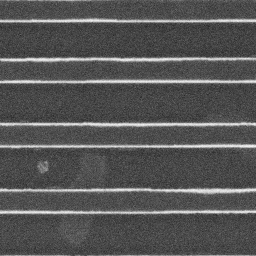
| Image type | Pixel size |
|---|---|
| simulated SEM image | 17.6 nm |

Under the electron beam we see lines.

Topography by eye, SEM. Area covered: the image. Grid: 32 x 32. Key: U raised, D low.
UUUUUUUUUUUUUUUUUUUUUUUUUUUUUUUU
UUUUUUUUUUUUUUUUUUUUUUUUUUUUUUUU
UUUUUUUUUUUUUUUUUUUUUUUUUUUUUUUU
DDDDDDDDDDDDDDDDDDDDDDDDDDDDDDDD
DDDDDDDDDDDDDDDDDDDDDDDDDDDDDDDD
DDDDDDDDDDDDDDDDDDDDDDDDDDDDDDDD
DDDDDDDDDDDDDDDDDDDDDDDDDDDDDDDD
UDDUUDDUUUUUUUUDUUUUUUUUUUUUUUUU
UUUUUUUUUUUUUUUUUUUUUUUUUUUUUUUU
UUUUUUUUUUUUUUUUUUUUUUUUUUUUUUUU
DDDDDDDDDDDDDDDDDDDDDDDDDDDDDDDD
DDDDDDDDDDDDDDDDDDDDDDDDDDDDDDDD
DDDDDDDDDDDDDDDDDDDDDDDDDDDDDDDD
DDDDDDDDDDDDDDDDDDDDDDDDDDDDDDDD
DDDDDDDDDDDDDDDDDDDDDDDDDDDDDDDD
DDUUDDUUUUUDDDDDDDDDDDDDDDDDUUUU
UUUUUUUUUUUUUUUUUUUUUUUUUUUUUUUU
UUUUUUUUUUUUUUUUUUUUUUUUUUUUUUUU
DDDDDDDDDDDDDDDDDDDDDDDDDDDDDDDD
DDDDDDDDDDDDDDDDDDDDDDDDDDDDDDDD
DDDDDDDDDDDDDDDDDDDDDDDDDDDDDDDD
DDDDDDDDDDDDDDDDDDDDDDDDDDDDDDDD
DDDDDDDDDDDDDDDDDDDDDDDDDDDDDDDD
DDDDDDDDDDDDDDDDDDDDDDDDDDDDDDDD
UUUUUUUUUUUUUUUUUUUUUUUUUUUUUUUU
UUUUUUUUUUUUUUUUUUUUUUUUUUUUUUUU
DDDDDDDDDDDDDDDDDDDDDDDDDDDDDDDD
DDDDDDDDDDDDDDDDDDDDDDDDDDDDDDDD
DDDDDDDDDDDDDDDDDDDDDDDDDDDDDDDD
DDDDDDDDDDDDDDDDDDDDDDDDDDDDDDDD
DDDDDDDDDDDDDDDDDDDDDDDDDDDDDDDD
DDDDDDDDDDDDDDDDDDDDDDDDDDDDDDDD